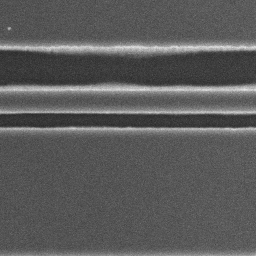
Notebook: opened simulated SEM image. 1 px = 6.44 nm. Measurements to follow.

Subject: lines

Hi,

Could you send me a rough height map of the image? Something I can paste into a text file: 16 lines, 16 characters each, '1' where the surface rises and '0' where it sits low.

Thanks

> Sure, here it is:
1111111111111111
1111111111111111
1111111111111111
0000000000000000
0000000000000000
0000000000000000
1111111111111111
1111111111111111
1111111111111111
1111111111111111
1111111111111111
1111111111111111
1111111111111111
1111111111111111
1111111111111111
1111111111111111